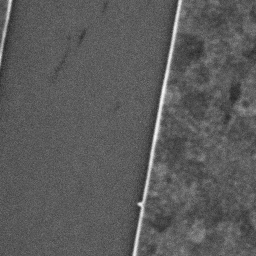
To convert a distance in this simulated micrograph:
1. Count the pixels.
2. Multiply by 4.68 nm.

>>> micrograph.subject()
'one or a few lines or trenches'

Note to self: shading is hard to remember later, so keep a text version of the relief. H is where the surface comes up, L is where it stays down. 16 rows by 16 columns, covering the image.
HLLLLLLLLLLHHHHH
LLLLLLLLLLLHHHHH
LLLLLLLLLLLHHHHH
LLLLLLLLLLLHHHHH
LLLLLLLLLLHHHHHH
LLLLLLLLLLHHHHHH
LLLLLLLLLLHHHHHH
LLLLLLLLLLHHHHHH
LLLLLLLLLLHHHHHH
LLLLLLLLLLHHHHHH
LLLLLLLLLHHHHHHH
LLLLLLLLLHHHHHHH
LLLLLLLLLHHHHHHH
LLLLLLLLLHHHHHHH
LLLLLLLLLHHHHHHH
LLLLLLLLHHHHHHHH